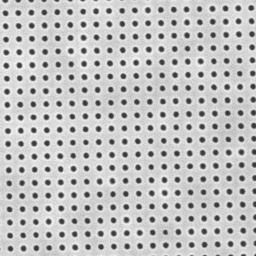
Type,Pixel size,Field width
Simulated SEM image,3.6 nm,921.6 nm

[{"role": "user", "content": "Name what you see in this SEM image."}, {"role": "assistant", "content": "a regular array of holes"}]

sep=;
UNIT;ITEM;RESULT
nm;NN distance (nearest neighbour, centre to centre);45.1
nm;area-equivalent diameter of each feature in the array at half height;20.7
